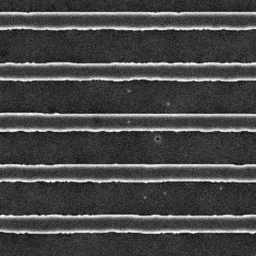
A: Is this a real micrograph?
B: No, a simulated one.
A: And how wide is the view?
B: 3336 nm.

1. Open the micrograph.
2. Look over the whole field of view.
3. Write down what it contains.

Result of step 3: lines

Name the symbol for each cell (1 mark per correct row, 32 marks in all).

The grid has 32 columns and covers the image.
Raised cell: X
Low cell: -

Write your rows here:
--------------------------------
--------------------------------
XXXXXXXXXXXXXXXXXXXXXXXXXXXXXXXX
XXXXXXXXXXXXXXXXXXXXXXXXXXXXXXXX
--------------------------------
--------------------------------
--------------------------------
--------------------------------
XXXXXXXXXXXXXXXXXXXXXXXXXXXXXXXX
XXXXXXXXXXXXXXXXXXXXXXXXXXXXXXXX
--------------------------------
--------------------------------
--------------------------------
--------------------------------
XXXXXXXXXXXXXXXXXXXXXXXXXXXXXXXX
XXXXXXXXXXXXXXXXXXXXXXXXXXXXXXXX
--------------------------------
--------------------------------
--------------------------------
--------------------------------
--------------------------------
XXXXXXXXXXXXXXXXXXXXXXXXXXXXXXXX
XXXXXXXXXXXXXXXXXXXXXXXXXXXXXXXX
--------------------------------
--------------------------------
--------------------------------
--------------------------------
XXXXXXXXXXXXXXXXXXXXXXXXXXXXXXXX
XXXXXXXXXXXXXXXXXXXXXXXXXXXXXXXX
--------------------------------
--------------------------------
--------------------------------